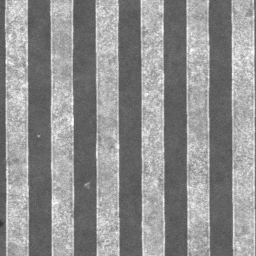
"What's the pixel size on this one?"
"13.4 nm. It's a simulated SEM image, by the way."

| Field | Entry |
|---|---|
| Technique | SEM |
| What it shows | wiring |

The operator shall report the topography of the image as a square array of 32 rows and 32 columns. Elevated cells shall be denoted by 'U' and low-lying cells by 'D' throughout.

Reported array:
DUUDDDUUUDDDUUUDDDUUDDDUUUDDDUUU
DUUDDDUUUDDDUUUDDDUUDDDUUUDDDUUU
DUUDDDUUUDDDUUUDDDUUDDDUUUDDDUUU
DUUDDDUUUDDDUUUDDDUUDDDUUUDDDUUU
DUUDDDUUUDDDUUUDDDUUDDDUUUDDDUUU
DUUDDDUUUDDDUUUDDDUUDDDUUUDDDUUU
DUUDDDUUUDDDUUUDDDUUDDDUUUDDDUUU
DUUDDDUUUDDDUUUDDDUUDDDUUUDDDUUU
DUUDDDUUUDDDUUUDDDUUDDDUUUDDDUUU
DUUDDDDUUDDDUUUDDDUUDDDUUUDDDUUU
DUUDDDDUUDDDUUUDDDUUDDDUUUDDDUUU
DUUDDDDUUDDDUUUDDDUUDDDUUUDDDUUU
DUUDDDDUUDDDUUUDDDUUDDDUUUDDDUUU
DUUDDDUUUDDDUUUDDDUUDDDUUUDDDUUU
DUUDDDUUUDDDUUUDDDUUDDDUUUDDDUUU
DUUDDDUUUDDDUUUDDDUUDDDDUUDDDUUU
DUUDDDDUUDDDUUUDDDUUDDDDUUDDDUUU
DUUDDDDUUDDDUUUDDDUUDDDDUUDDDUUU
DUUDDDDUUDDDUUUDDDUUDDDDUUDDDUUU
DUUDDDDUUDDDUUUDDDUUDDDDUUDDDUUU
DUUDDDDUUDDDUUUDDDUUDDDDUUDDDUUU
DUUDDDDUUDDDUUUDDDUUDDDDUUDDDUUU
DUUDDDDUUDDDUUUDDDUUDDDDUUDDDUUU
DUUDDDDUUDDDUUUDDDUUDDDDUUDDDUUU
DUUDDDDUUDDDUUUDDDUUDDDDUUDDDUUU
DUUDDDDUUDDDUUUDDDUUDDDDUUDDDUUU
DUUDDDDUUDDDUUUDDDUUDDDDUUDDDUUU
DUUDDDDUUDDDUUUDDDUUDDDDUUDDDUUU
DUUDDDDUUDDDUUUDDDUUDDDDUUDDDUUU
DUUDDDDUUDDDUUUDDDUUDDDDUUDDDUUU
DUUDDDDUUDDDUUUDDDUUDDDDUUDDDUUU
DUUDDDDUUDDDUUUDDDUUDDDDUUDDDUUU